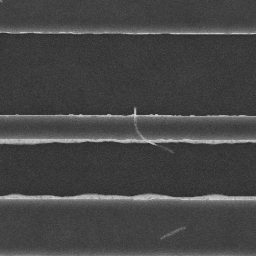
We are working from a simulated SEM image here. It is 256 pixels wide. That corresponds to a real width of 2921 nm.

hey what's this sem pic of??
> lines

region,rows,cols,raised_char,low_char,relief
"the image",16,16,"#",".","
################
################
................
................
................
................
................
################
################
................
................
................
################
################
################
################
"